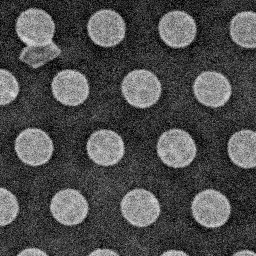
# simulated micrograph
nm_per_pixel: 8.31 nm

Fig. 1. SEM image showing a regular array of raised bodies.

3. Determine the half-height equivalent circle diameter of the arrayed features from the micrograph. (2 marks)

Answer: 0.304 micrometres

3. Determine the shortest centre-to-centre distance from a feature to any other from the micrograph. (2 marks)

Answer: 575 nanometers